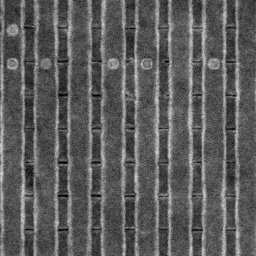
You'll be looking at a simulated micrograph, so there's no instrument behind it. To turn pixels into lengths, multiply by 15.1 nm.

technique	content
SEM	wiring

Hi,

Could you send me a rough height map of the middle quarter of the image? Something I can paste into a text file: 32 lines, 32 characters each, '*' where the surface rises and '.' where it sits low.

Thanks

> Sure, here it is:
.******...**.**...**..**...*****
.******...*****...*****....*****
.******...*****...*****....*****
.******...*****...*****....*****
.******...*****...*****....*****
.******...*****...*****....*****
.******...*****...*****....*****
.*****....*****...*****....*****
.******...*****...*****....*****
.******...*****...*****....*****
.******...*****...*****....*****
.******...*****...*****....*****
.******...*****...*****....*****
.******...*****...*****....*****
.******...*****...*****....*****
.******...*****...*****....****.
.******...*****...*****....*****
.******...*****...*****...******
.******...*****...*****...******
.******...*****...*****...******
.******...*****...*****...******
.******...*****...*****...******
.******...*****...*****...******
.******...*****...*****...******
.*****....*****...*****....*****
.******...*****...*****...******
.******...*****...*****...******
.******...*****...*****...******
.******...*****...*****...******
.******...*****...*****...******
.******...*****...*****...******
.******...*****...*****...******